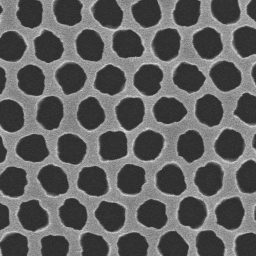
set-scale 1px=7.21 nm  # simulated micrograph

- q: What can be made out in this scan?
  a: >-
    a regular array of holes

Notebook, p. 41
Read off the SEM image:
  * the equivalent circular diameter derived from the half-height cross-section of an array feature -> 218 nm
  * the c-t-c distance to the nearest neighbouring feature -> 272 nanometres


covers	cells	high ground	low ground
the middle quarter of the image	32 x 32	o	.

....oooooo..ooooooo....oooooo...
.....oooo.....ooooo.....oooo....
.....ooo.......ooo.......oo.....
......oo.......oo........oo.....
.....ooo.......oo.......ooo.....
.....ooo.......ooo......oooo....
....oooo......ooooo.....oooooo..
..oooooooo...ooooooo...ooooooooo
oooooo..ooooooo....ooooo....oooo
oooo.....ooooo......ooo......ooo
oooo.....oooo.......oo........oo
ooo.......ooo.......oo.........o
ooo.......ooo.......ooo........o
ooo.......ooo.......ooo.......oo
oooo......oooo.....ooooo.....ooo
ooooo....ooooo....oooooooooooooo
oooooooooooooooo.oooo.ooooooooo.
o.oooooooo.....oooo.....oooooo..
....ooooo.......oo.......oooo...
.....oooo.......oo.......ooo....
......ooo.......o........ooo....
......ooo.......o.......oooo....
.....oooo.......oo......oooo....
.....oooo.....oooo.....ooooooo..
....ooooooooooooooooooooooooooo.
ooooooo.ooooooo....oooooo...oooo
oooo......oooo......oooo.....ooo
.ooo......ooo.......ooo.......oo
.ooo.......oo.......ooo.......oo
.oo........oo.......ooo.......oo
.oo........oo.......ooo........o
.oooo......ooo.....ooooo......oo